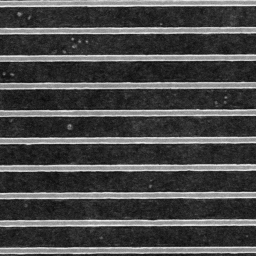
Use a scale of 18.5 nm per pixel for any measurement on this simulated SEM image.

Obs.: parallel lines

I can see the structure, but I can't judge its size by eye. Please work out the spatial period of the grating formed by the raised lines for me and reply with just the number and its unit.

509 nm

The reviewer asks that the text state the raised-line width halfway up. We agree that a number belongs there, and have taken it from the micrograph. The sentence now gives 95 nanometres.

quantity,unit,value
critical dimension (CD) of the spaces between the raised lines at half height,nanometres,410